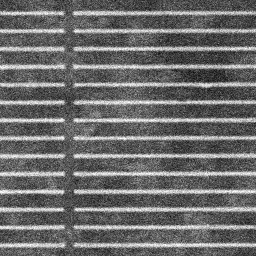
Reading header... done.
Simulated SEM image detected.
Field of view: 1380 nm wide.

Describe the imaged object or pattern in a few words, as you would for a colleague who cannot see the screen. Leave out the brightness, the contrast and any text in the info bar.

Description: parallel lines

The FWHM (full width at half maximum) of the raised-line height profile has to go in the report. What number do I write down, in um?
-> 0.0135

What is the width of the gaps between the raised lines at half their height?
0.0815 µm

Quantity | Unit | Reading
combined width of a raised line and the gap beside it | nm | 96.1